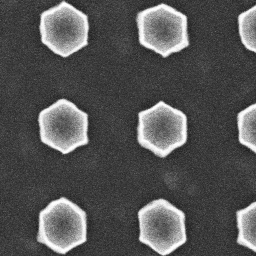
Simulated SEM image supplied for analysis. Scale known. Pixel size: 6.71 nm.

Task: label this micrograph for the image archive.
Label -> raised bodies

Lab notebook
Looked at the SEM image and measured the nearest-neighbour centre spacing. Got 661 nm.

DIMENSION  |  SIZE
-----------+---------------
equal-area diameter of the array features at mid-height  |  320 nm